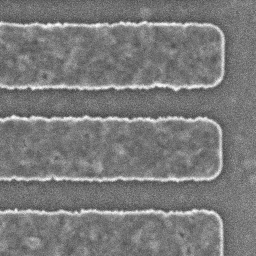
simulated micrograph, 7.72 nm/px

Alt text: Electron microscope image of one or a few lines or trenches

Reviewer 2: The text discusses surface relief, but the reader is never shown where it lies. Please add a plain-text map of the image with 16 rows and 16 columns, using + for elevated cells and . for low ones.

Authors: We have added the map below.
................
+......++++.+...
++++++++++++++..
++++++++++++++..
++++++++++++++..
.....++....+....
................
+++++++++++++...
++++++++++++++..
++++++++++++++..
++++++++++++++..
................
................
++++++++++++++..
++++++++++++++..
++++++++++++++..